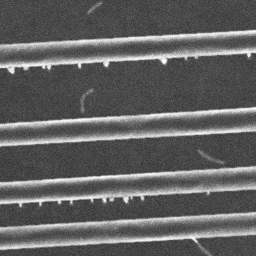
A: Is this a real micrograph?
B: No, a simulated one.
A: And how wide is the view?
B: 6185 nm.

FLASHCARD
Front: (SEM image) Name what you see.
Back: lines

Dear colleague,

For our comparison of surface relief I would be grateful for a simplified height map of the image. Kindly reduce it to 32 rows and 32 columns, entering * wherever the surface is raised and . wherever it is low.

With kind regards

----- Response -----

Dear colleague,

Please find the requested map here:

................................
................................
................................
................................
......................**********
.......*************************
*******************************.
*************...................
................................
................................
................................
................................
................................
................................
...................*************
..******************************
*****************************...
**********......................
................................
................................
................................
.........................*******
......**************************
*******************************.
*************...................
................................
................................
...................*************
...*****************************
**************************......
********........................
................................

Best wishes